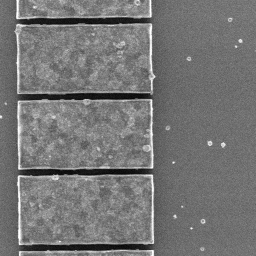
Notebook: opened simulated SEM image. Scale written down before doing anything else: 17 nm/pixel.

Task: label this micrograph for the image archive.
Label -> wiring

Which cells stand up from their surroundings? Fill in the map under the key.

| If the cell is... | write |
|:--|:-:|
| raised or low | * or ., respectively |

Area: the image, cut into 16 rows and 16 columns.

.********.......
.********.......
.********.......
.********.......
.*********......
.********.......
.********.......
.********.......
.********.......
.*********......
..*******.......
.*********......
.*********......
.*********......
.*********......
...******.......